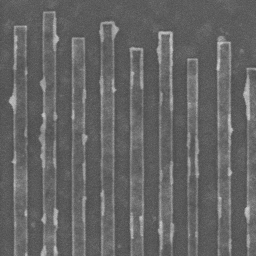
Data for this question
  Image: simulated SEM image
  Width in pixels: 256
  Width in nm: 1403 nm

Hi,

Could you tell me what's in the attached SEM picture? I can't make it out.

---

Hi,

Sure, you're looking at parallel lines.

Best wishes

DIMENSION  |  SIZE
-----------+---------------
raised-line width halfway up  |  0.0691 microns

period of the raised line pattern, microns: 0.16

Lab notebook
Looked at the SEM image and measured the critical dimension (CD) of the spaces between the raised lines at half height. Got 0.0924 microns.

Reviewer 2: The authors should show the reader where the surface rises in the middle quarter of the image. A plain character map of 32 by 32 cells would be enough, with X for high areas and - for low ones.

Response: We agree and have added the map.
--XXX----XXX-----XXX----XXX----X
--XXX----XXX-----XXX----XXX----X
--XXX----XXX-----XXX----XXX----X
--XXX----XXX-----XXX----XXX----X
--XXX----XXX-----XXX----XXX----X
--XXX----XXXX----XXX----XXX----X
--XXX----XXXX----XXX----XXX----X
--XXX----XXX-----XXX----XXX----X
--XXX----XXX-----XXX----XXX----X
--XXX----XXX-----XXX----XXX----X
--XXX----XXX-----XXX----XXX----X
--XXX----XXX-----XXX----XXX----X
--XXX----XXX-----XXX----XXX----X
--XXX----XXX-----XXX----XXX----X
--XXX----XXX-----XXX----XXX----X
--XXX----XXX-----XXX----XXX----X
--XXX----XXX-----XXX----XXX----X
--XXX-----XX-----XXX----XXX----X
--XXXX----XX-----XXX----XXX----X
--XXX-----XX-----XXX----XXX----X
--XXX-----XX-----XXX----XXX----X
--XXX-----XX-----XXX----XXX----X
--XXX-----XX-----XXX----XXX----X
--XXX-----XX-----XXX----XXX----X
--XXX-----XX-----XXX----XXX----X
--XXX----XXX-----XXX----XXX----X
--XXX----XXX-----XXX----XXX----X
--XXX-----XX-----XXX----XXX----X
--XXX-----XX-----XXX----XXX----X
--XXX-----XX-----XXX----XXX----X
--XXX-----XX-----XXX----XXX----X
--XXX----XXX-----XXX----XXX----X